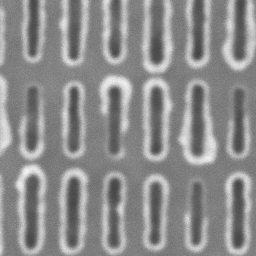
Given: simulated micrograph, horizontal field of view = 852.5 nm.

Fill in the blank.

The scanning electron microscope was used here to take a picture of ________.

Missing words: a regular array of holes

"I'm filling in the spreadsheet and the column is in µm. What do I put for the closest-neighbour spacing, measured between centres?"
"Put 0.137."